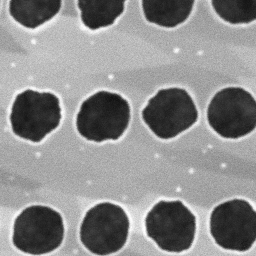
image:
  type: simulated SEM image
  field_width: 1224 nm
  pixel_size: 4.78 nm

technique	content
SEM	holes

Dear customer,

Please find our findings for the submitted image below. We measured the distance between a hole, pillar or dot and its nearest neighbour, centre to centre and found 326 nm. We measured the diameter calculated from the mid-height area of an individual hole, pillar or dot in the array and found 51.9 pixels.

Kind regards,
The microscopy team